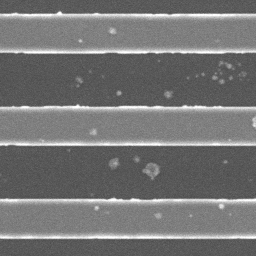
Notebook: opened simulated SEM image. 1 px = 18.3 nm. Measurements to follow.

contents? lines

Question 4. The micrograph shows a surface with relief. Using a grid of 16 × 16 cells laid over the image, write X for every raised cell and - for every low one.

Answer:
----------------
XXXXXXXXXXXXXXXX
XXXXXXXXXXXXXXXX
----------------
----------------
----------------
----------------
XXXXXXXXXXXXXXXX
XXXXXXXXXXXXXXXX
----------------
----------------
----------------
XXXXXXXXXXXXXXXX
XXXXXXXXXXXXXXXX
XXXXXXXXXXXXXXXX
----------------